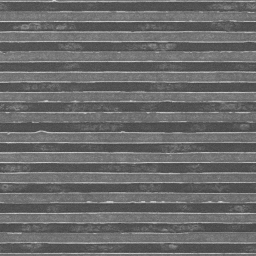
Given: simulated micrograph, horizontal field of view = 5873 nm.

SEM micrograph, parallel lines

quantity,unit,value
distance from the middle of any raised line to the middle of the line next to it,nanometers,461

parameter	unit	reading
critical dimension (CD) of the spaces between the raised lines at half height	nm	235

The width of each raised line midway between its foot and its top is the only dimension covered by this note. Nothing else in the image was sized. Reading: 215 nanometers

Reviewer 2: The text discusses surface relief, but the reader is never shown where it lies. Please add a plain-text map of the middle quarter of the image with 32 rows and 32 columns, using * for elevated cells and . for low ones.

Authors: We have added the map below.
................................
................................
********************************
********************************
................................
................................
................................
********************************
********************************
................................
................................
................................
********************************
********************************
................................
................................
................................
********************************
********************************
********************************
................................
................................
********************************
********************************
*********************.**.*.**...
................................
................................
********************************
********************************
********************************
................................
................................